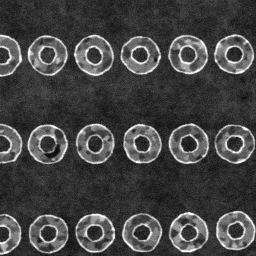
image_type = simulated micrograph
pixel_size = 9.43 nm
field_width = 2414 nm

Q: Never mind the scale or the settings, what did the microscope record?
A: a regular array of ring-shaped raised bodies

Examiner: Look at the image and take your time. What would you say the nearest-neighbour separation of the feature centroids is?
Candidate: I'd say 437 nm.